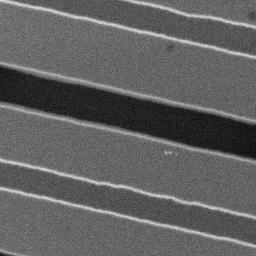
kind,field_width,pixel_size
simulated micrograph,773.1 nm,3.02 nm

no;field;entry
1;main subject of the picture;lines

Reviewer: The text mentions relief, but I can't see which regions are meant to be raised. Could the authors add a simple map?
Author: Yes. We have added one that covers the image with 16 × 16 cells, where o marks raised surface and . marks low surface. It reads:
oooooooooooooooo
oooooooooooooooo
oooooooooooooooo
oooooooooooooooo
..oooooooooooooo
.......ooooooooo
...........ooooo
oooo...........o
ooooooooo.......
ooooooooooooo...
oooooooooooooooo
oooooooooooooooo
oooooooooooooooo
oooooooooooooooo
oooooooooooooooo
oooooooooooooooo